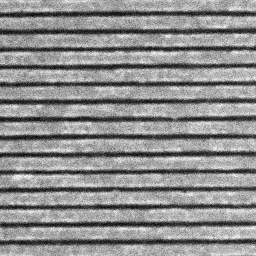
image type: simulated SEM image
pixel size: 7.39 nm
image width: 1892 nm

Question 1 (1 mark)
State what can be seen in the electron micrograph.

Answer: parallel lines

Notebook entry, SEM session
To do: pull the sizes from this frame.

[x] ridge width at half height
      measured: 86.9 nanometres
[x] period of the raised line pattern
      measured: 0.13 µm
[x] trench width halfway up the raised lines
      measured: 0.0434 µm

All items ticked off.